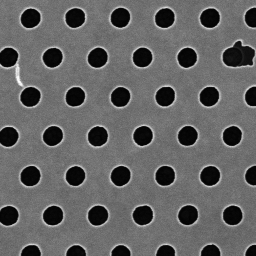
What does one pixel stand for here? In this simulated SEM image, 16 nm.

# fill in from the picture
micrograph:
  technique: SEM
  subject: a regular array of holes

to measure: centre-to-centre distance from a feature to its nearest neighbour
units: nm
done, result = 715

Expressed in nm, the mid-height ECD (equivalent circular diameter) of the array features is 320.